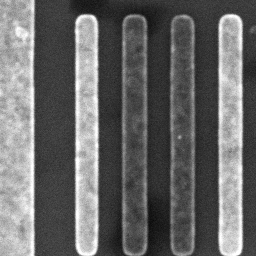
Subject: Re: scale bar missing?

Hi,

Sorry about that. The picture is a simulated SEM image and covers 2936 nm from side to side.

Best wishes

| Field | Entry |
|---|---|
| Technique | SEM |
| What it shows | wiring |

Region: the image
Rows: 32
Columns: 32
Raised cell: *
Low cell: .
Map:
****............................
****............................
****......**....**....**....**..
****.....***...***...***....**..
****.....***...***...***....**..
****......**...***...***....**..
****......**...***...***....**..
****......**...***...***....**..
****......**...***...***....**..
****......**...***...***....**..
****......**...***...***....**..
****......**...***...***....**..
****......**...***...***....**..
****......**...***...***....**..
****......**...***...***....**..
****......**...***...***....**..
****......**...***...***...***..
****......**...***...***...***..
****......**...***...***...***..
****.....***...***...***....**..
****.....***...***...***....**..
****......**...***...***....**..
****......**...***...***....**..
****......**...***...***....**..
****......**...***...***....**..
****......**...***...***....**..
****......**...***...***....**..
****......**...***...***....**..
****......**...***...***....**..
****......**...***...***....**..
****......**...***...***....**..
****......**....**....**....**..